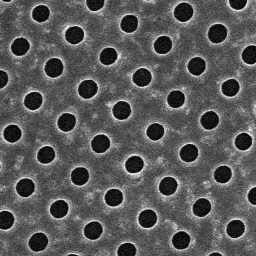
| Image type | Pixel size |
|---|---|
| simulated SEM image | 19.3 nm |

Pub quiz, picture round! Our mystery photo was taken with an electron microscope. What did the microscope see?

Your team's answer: a regular array of holes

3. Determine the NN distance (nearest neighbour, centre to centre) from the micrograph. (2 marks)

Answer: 0.747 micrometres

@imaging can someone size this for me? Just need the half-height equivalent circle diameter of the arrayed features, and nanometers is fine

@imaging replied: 366